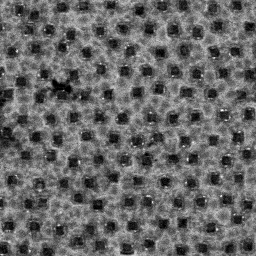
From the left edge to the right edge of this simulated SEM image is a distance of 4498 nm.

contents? a regular array of raised bodies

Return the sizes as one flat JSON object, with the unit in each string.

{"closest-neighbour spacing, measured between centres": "18.7 px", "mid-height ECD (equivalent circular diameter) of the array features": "194 nm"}